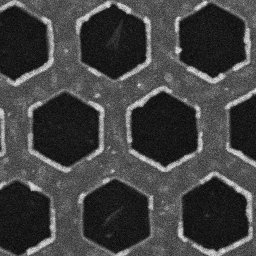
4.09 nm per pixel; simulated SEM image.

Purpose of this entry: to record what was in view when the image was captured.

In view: holes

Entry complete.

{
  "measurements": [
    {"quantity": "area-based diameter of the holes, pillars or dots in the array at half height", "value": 285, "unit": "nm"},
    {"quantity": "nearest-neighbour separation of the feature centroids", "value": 403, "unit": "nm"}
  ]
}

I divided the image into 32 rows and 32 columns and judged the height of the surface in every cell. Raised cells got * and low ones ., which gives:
**************************.*****
...*********....********.....***
.....******.......*****.......**
......****........****.........*
......****........****.........*
......****........****.........*
......****........*****........*
......****........****.........*
.....*******.....*******.....***
*..**********..***********.*****
********************************
********************.***********
******....*********...*********.
*****.......*****.......*****...
****........****........*****...
****........****.........****...
****.........***.........****...
****........****.........****...
****........*****........****...
******.....*******.....********.
*******..***********.***********
********************************
**************.***********..****
....********.....*******.....***
......*****.......*****.......**
......****.........****........*
......****.........****........*
......****.........****........*
......****.........****........*
......*****........****........*
.....*******.....********....***
*..***********.*****************